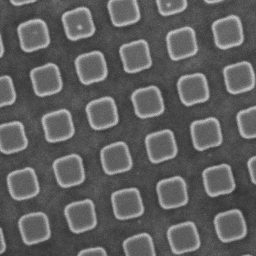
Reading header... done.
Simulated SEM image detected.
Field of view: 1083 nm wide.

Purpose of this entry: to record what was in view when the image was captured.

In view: a regular array of raised bodies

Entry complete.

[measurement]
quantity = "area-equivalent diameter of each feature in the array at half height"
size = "129 nanometres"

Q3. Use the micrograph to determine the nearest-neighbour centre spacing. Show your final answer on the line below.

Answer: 197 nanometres